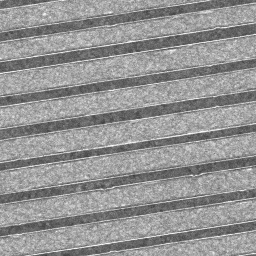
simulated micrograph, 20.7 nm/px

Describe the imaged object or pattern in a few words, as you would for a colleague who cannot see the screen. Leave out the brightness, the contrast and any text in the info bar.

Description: parallel lines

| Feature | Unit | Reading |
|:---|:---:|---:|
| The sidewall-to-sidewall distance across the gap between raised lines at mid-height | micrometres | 0.455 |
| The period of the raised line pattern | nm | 665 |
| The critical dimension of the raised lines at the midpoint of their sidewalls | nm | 209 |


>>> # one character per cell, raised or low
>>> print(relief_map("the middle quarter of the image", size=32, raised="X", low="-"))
--------------------------------
-----------------------------XXX
----------------------XXXXXXXXXX
----------------XXXXXXXXXXXXXXXX
---------XXXXXXXXXXXXXXXX-------
--XXXXXXXXXXXXXXXX--------------
XXXXXXXXXXXXX-------------------
XXXXX---------------------------
--------------------------------
----------------------------XXXX
----------------------XXXXXXXXXX
---------------XXXXXXXXXXXXXXXXX
--------XXXXXXXXXXXXXXXXXXX-----
--XXXXXXXXXXXXXXXXXX------------
XXXXXXXXXXXXXX------------------
XXXXXXX-------------------------
X-------------------------------
-------------------------------X
-------------------------XXXXXXX
------------------XXXXXXXXXXXXXX
------------XXXXXXXXXXXXX-------
-----XXXXXXXXXXXXXX-------------
XXXXXXXXXXXX--------------------
XXXXXX--------------------------
--------------------------------
XX-----------------------------X
-X----------------------XXXXXXXX
------------------XXXXXXXXXXXXXX
-----------XXXXXXXXXXXXXXXX-----
-----XXXXXXXXXXXXXXXX-----------
XXXXXXXXXXXXXX------------------
XXXXXXXX------------------------